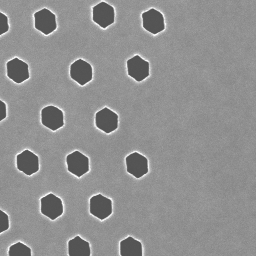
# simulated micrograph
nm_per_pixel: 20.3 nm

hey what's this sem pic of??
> a regular array of holes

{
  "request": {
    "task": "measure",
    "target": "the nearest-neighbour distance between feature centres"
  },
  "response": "1020 nm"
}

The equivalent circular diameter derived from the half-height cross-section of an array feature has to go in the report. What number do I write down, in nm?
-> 474